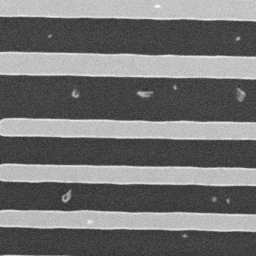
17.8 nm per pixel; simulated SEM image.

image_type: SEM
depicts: groups of lines, slits or small figures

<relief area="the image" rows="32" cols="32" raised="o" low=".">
oooooooooooooooooooooooooooooooo
oooooooooooooooooooooooooooooooo
...............................o
................................
................................
................................
................................
oooooooooooooooooooooooooooooooo
oooooooooooooooooooooooooooooooo
................oooooooooooooooo
................................
................................
................................
................................
................................
oooooooooooooooooooooooooooooooo
oooooooooooooooooooooooooooooooo
................................
................................
................................
................................
oooooooooooooooooooooooooooooooo
oooooooooooooooooooooooooooooooo
................................
................................
................................
ooooooooooooo...................
oooooooooooooooooooooooooooooooo
............oooooooooooooooooooo
................................
................................
................................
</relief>